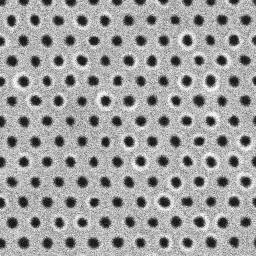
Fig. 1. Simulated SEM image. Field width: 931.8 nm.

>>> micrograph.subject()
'a regular array of holes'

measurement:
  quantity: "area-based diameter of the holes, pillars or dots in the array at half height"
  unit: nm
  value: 38.5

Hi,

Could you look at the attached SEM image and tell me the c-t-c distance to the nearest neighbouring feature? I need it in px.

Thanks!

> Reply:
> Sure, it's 22.9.